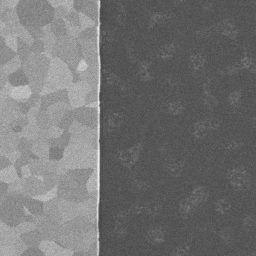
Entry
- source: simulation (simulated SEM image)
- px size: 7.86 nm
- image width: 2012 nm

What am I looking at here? one or a few lines or trenches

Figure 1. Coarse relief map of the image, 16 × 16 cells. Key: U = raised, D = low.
UUUUUUDDDDDDDDDD
UUUUUUDDDDDDDDDD
UUUUUUDDDDDDDDDD
UUUUUUDDDDDDDDDD
UUUUUUDDDDDDDDDD
UUUUUUDDDDDDDDDD
UUUUUUDDDDDDDDDD
UUUUUUDDDDDDDDDD
UUUUUUDDDDDDDDDD
UUUUUUDDDDDDDDDD
UUUUUUDDDDDDDDDD
UUUUUUDDDDDDDDDD
UUUUUUDDDDDDDDDD
UUUUUUDDDDDDDDDD
UUUUUUDDDDDDDDDD
UUUUUUDDDDDDDDDD